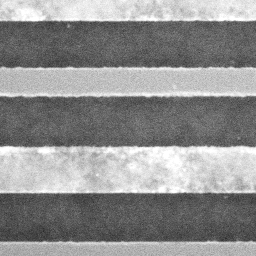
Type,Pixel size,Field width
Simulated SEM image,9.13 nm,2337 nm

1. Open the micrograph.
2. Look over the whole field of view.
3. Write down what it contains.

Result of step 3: lines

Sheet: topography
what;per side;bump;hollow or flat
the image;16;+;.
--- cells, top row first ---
++++++++++++++++
................
................
................
++++++++++++++++
++++++++++++++++
................
................
................
++++++++++++++++
++++++++++++++++
++++++++++++++++
................
................
................
++++++++++++++++